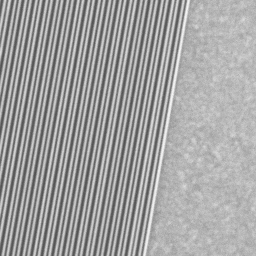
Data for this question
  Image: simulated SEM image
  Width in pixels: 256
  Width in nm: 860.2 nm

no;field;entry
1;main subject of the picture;parallel lines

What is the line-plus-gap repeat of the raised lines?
5.15 pixels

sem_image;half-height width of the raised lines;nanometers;6.2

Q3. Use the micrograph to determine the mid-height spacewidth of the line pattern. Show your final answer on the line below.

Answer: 0.0095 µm